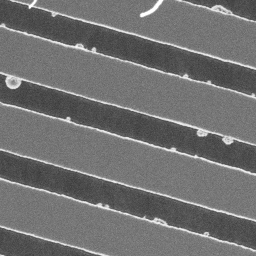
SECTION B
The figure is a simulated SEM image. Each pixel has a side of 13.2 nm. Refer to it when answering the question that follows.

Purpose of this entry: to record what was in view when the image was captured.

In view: lines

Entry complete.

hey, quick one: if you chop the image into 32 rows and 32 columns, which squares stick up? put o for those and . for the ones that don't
...ooooooooooooooooooooo........
.......ooooooooooooooooooooo....
..........ooooooooooooooooooooo.
o.............oooooooooooooooooo
ooooo............ooooooooooooooo
oooooooo.............ooooooooooo
oooooooooooo............oooooooo
ooooooooooooooo.............oooo
ooooooooooooooooooo............o
.ooooooooooooooooooooo..........
.o...ooooooooooooooooooooo......
........oooooooooooooooooooooo..
............oooooooooooooooooooo
ooo............ooooooooooooooooo
oooooo.............ooooooooooooo
oooooooooo.............ooooooooo
ooooooooooooo.............oooooo
ooooooooooooooooo............ooo
oooooooooooooooooooo............
..oooooooooooooooooooooo........
......oooooooooooooooooooooo....
..........ooooooooooooooooooooo.
o............ooooooooooooooooooo
oooo.............ooooooooooooooo
oooooooo.............ooooooooooo
ooooooooooo.............oooooooo
ooooooooooooooo.............oooo
ooooooooooooooooooo............o
oooooooooooooooooooooo..........
....oooooooooooooooooooooo......
........ooooooooooooooooooooo...
...........ooooooooooooooooooooo